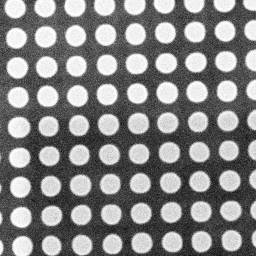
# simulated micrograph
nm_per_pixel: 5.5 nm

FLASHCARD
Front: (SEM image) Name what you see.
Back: an array of small figures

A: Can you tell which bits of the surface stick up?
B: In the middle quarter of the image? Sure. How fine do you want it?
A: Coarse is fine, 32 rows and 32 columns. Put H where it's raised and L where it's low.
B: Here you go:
LHHHHLLLLHHHHLLLHHHHHLLHHHHHLLLH
LHHHHLLLLHHHHLLLHHHHLLLLHHHLLLLL
LLHHLLLLLLHLLLLLLLLLLLLLLLLLLLLL
LLLLLLLLLLLLLLLLLLLLLLLLLLLLLLLL
LLLLLLLLLLLLLLLLLLLLLLLLLLLLLLLL
LLLLLLLLLLHHLLLLLHHHLLLLHHHHLLLH
LHHHHLLLLHHHHLLLHHHHLLLLHHHHLLLH
LHHHHHLLLHHHHLLLHHHHHLLHHHHHLLLH
LHHHHHLLLHHHHLLLHHHHLLLLHHHHLLLH
LHHHHLLLLHHHLLLLLHHLLLLLLHHLLLLL
LLLLLLLLLLLLLLLLLLLLLLLLLLLLLLLL
LLLLLLLLLLLLLLLLLLLLLLLLLLLLLLLL
LLLLLLLLLLLLLLLLLLHLLLLLLHHLLLLL
LLHHHLLLLHHHHLLLHHHHHLLLHHHHLLLL
LHHHHHLLLHHHHHLLHHHHHLLLHHHHLLLH
LHHHHHLLLHHHHHLLHHHHHLLLHHHHLLLH
LLHHHHLLLHHHHLLLLHHHLLLLHHHLLLLL
LLLHHLLLLLLHLLLLLLLLLLLLLLLLLLLL
LLLLLLLLLLLLLLLLLLLLLLLLLLLLLLLL
LLLLLLLLLLLLLLLLLLLLLLLLLLLLLLLL
LLLHHLLLLLHHLLLLLHHHLLLLHHHHLLLL
LLHHHHLLLHHHHLLLHHHHHLLLHHHHHLLL
LHHHHHLLLHHHHHLLLHHHHLLLHHHHHLLL
LLHHHHLLLHHHHHLLLHHHHLLLHHHHLLLL
LLHHHLLLLLHHHLLLLLHHLLLLLLHLLLLL
LLLLLLLLLLLLLLLLLLLLLLLLLLLLLLLL
LLLLLLLLLLLLLLLLLLLLLLLLLLLLLLLL
LLLLLLLLLLLLLLLLLLHHLLLLLHHHLLLL
LLHHHHLLLLHHHHLLLHHHHLLLHHHHHLLL
LLHHHHHLLHHHHHLLLHHHHLLLHHHHHLLL
LLHHHHHLLHHHHHLLLHHHHLLLHHHHHLLL
LLHHHHLLLLHHHLLLLHHHHLLLLHHHLLLL